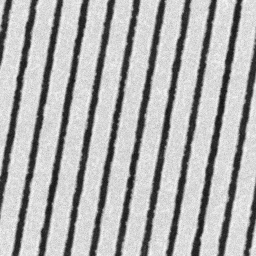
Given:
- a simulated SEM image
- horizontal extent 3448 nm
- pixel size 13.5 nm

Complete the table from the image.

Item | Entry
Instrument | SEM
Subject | parallel lines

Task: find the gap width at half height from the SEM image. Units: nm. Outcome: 101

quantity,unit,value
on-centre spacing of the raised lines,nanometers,340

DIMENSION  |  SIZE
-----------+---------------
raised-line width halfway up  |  240 nm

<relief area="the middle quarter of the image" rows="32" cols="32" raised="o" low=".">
o...oooo..oooo..ooooo..oooo..ooo
o...oooo..oooo..ooooo..oooo..ooo
o..ooooo..oooo..oooo...oooo..ooo
o..ooooo.ooooo..oooo..ooooo..ooo
o..oooo..ooooo..oooo..oooo..oooo
o..oooo..ooooo..oooo..oooo..oooo
...oooo..oooo..ooooo..oooo..oooo
..ooooo..oooo..ooooo..oooo..oooo
..ooooo..oooo..oooo...oooo..oooo
..oooo...oooo..oooo..ooooo..oooo
..oooo..ooooo..oooo..oooo..ooooo
..oooo..oooo...oooo..oooo..ooooo
..oooo..oooo..oooo...oooo..oooo.
.ooooo..oooo..oooo...oooo..oooo.
.oooo...oooo..oooo...oooo..oooo.
.oooo..ooooo..oooo..oooo...oooo.
.oooo..ooooo..oooo..oooo...oooo.
.oooo..oooo..ooooo..oooo..ooooo.
ooooo..oooo..ooooo..oooo..oooo..
ooooo..oooo..ooooo..oooo..oooo..
oooo...oooo..oooo..ooooo..oooo..
oooo...oooo..oooo..oooo...oooo..
oooo..ooooo..oooo..oooo..ooooo..
oooo..oooo...oooo..oooo..oooo...
oooo..oooo..ooooo..oooo..oooo..o
oooo..oooo..oooo..ooooo..oooo..o
ooo...oooo..oooo..oooo...oooo..o
ooo..ooooo..oooo..oooo...oooo..o
ooo..oooo...oooo..oooo..ooooo..o
ooo..oooo..ooooo..oooo..oooo...o
ooo..oooo..ooooo..oooo..oooo...o
ooo..oooo..oooo..ooooo..oooo..oo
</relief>